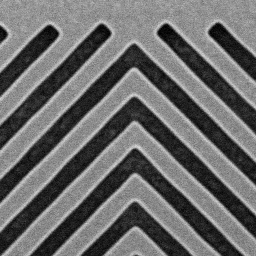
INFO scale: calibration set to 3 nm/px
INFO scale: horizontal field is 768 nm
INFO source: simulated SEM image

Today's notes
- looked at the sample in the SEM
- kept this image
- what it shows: groups of lines, slits or small figures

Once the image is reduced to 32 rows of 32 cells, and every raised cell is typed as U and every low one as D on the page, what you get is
UUUUUUUUUUUUUUUUUUUUUUUUUUUUUUUU
UUUUUUUUUUUUUUUUUUUUUUUUUUUUUUUU
UUUUUUUUUUUUUUUUUUUUUUUUUUUUUUUU
DUUUUDDUUUUUDDUUUUUUDDUUUUDDUUUU
DUUUDDDUUUUDDDUUUUUUDDDUUUDDDUUU
UUUDDDDUUUDDDUUUUUUUUDDDUUUDDDUU
UUDDDDUUUDDDUUUUDDUUUUDDDUUUDDDU
UDDDDUUUDDDUUUUDDDDUUUUDDDUUUDDD
UDDUUUUDDDUUUDDDDDDDUUUUDDDUUUDD
DDDUUUDDDUUUDDDDUUDDDUUUUDDDUUUD
DDUUUDDDUUUUDDDUUUUDDDUUUUDDDUUU
DUUUDDDUUUUDDDUUUUUUDDDUUUUDDDUU
UUUDDDUUUUDDDUUUDUUUUDDDUUUUDDDU
UUDDDUUUUDDDUUUDDDDUUUDDDUUUUDDD
UDDDUUUUDDDUUUDDDDDDUUUDDDUUUUDD
DDDUUUUDDDUUUDDDUDDDDUUUDDDUUUUD
DDUUUUDDDUUUDDDUUUDDDDUUUDDDUUUU
DUUUUDDDUUUDDDUUUUUDDDDUUUDDDUUU
UUUUDDDUUUDDDUUUUUUUUDDDUUUDDDUU
UUUDDDUUUDDDUUUUDDUUUUDDDUUUDDDU
UUDDDUUUDDDUUUUDDDDUUUDDDDUUUDDD
UDDDUUUDDDUUUUDDDDDDUUUDDDDUUUDD
DDDUUUDDDUUUUDDDUUDDDUUUDDDDUUUD
DDUUUDDDUUUUDDDUUUUDDDUUUUDDUUUU
DUUUDDDUUUUDDDUUUUUUDDDUUUUDDDUU
UUUDDDUUUUDDDUUUDUUUUDDDUUUUDDDU
UUDDDUUUUDDDUUUDDDUUUUDDDUUUUDDD
UDDDUUUUDDDUUUDDDDDUUUUDDDUUUUDD
UDDDUUUDDDUUUUDDDDDDUUUUDDDUUUUD
DDUUUUDDDUUUDDDUUUDDDDUUUDDDUUUU
DDUUUDDDUUUDDDUUUUUDDDDUUUDDDUUU
DUUUDDDUUUDDDUUUUUUUDDDDUUUDDDUU